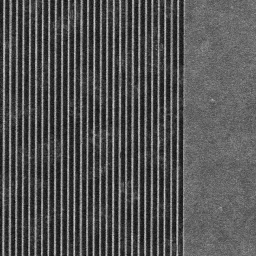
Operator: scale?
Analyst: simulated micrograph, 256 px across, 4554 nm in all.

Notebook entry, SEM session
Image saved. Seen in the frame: parallel lines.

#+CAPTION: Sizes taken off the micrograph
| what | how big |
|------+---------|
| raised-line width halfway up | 0.0245 µm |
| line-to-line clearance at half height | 91.2 nm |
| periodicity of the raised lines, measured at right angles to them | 115 nm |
